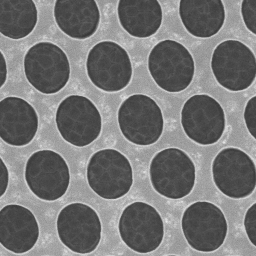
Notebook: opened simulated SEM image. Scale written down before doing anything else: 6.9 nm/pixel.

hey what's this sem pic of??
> a regular array of holes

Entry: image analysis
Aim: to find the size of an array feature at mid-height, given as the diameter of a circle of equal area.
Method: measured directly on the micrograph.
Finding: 328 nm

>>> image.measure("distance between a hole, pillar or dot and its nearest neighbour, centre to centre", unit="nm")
427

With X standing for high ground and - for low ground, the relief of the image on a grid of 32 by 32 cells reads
----XXX-----XXX-----XXX-----XX--
-----XX-----XXX-----XX------XX--
-----XX-----XXX-----XXX-----XXX-
----XXXX----XXXX----XXX-----XXX-
X--XXXXXX--XXXXXX--XXXXX--XXXXXX
XXXXX--XXXXX---XXXXX---XXXXX--XX
XXXX----XXX-----XXX-----XXX----X
-XX-----XXX-----XXX-----XXX-----
-XX------XX-----XXX-----XXX-----
-XX------XX-----XXX-----XXX-----
XXXX----XXXX----XXXX----XXXX---X
XXXXX--XXXXXXXXXXXXXXXXXXXXXXXXX
---XXXXX---XXXXX---XXXX----XXXX-
----XXX-----XXX-----XXX-----XXX-
-----XX-----XXX-----XXX-----XXX-
-----XX------XX-----XXX-----XXX-
-----XX------XX-----XXX-----XXX-
----XXXX----XXXX----XXXX---XXXXX
XXXXXXXXXXXXXXXXXXXXXXXXXXXXXXXX
XXXX----XXXX---XXXX----XXXX----X
-XX-----XXX-----XXX-----XXX-----
-XX------XX-----XXX-----XXX-----
-XX------XX------XX-----XXX-----
-XXX----XXX-----XXX-----XXX-----
XXXXX---XXXXX--XXXXX---XXXXXX--X
XXXXXXXXX-XXXXXXX-XXXXXX--XXXXXX
----XXXX----XXX-----XXX-----XXX-
----XXX-----XXX-----XXX-----XXX-
-----XX------XX-----XXX-----XXX-
-----XX------XX-----XXX-----XXX-
----XXXX----XXXX----XXXX----XXXX
XX-XXXXXX--XXXXXX--XXXXXXXXXXXXX